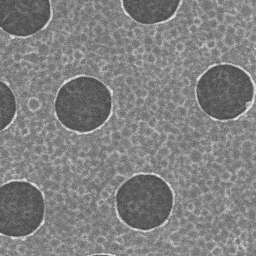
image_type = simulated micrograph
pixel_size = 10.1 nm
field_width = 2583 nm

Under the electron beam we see holes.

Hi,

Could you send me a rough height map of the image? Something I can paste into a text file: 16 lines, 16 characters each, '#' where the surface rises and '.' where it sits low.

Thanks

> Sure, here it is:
...#####...#####
...#############
################
################
#############..#
.###...#####....
.##....#####....
.###...#########
################
################
################
..######..######
...####....#####
...#####...#####
..##############
################